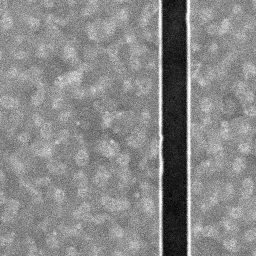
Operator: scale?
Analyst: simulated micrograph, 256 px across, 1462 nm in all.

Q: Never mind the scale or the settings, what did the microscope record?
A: one or a few lines or trenches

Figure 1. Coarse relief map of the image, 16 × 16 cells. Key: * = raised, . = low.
**********..****
**********..****
**********..****
**********..****
**********..****
**********..****
**********..****
**********..****
**********..****
**********..****
**********..****
**********..****
**********..****
**********..****
**********..****
**********..****